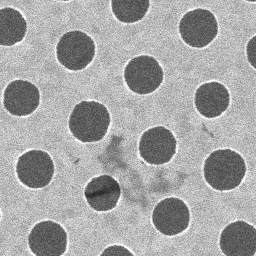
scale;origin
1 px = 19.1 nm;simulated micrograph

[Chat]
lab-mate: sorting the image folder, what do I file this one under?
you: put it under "a regular array of holes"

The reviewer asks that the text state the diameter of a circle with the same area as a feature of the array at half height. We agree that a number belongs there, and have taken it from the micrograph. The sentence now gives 39.4 px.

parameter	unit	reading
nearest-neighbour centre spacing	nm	1360